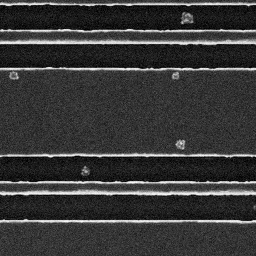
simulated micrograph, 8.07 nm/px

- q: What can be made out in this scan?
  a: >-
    lines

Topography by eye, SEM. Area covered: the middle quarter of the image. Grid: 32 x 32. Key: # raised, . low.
................................
################################
################################
################################
################################
################################
################################
################################
################################
################################
################################
################################
################################
################################
################################
################################
################################
################################
################################
################################
################################
################################
################################
................................
................................
................................
................................
................................
................................
###..#####..##..####....########
################################
################################